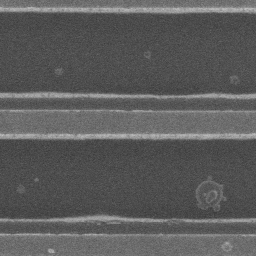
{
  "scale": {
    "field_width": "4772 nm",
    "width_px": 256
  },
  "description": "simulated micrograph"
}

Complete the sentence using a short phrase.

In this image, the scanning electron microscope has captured lines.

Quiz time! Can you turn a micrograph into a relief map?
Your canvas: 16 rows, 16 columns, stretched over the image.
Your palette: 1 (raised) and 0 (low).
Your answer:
1111111111111111
0000000000000000
0000000000000000
0000000000000000
0000000000000000
0000000000000000
1111111111111111
1111111111111111
0011111111101111
0000000000000000
0000000000000000
0000000000000000
0000000000000000
0000000000000000
1111111111111111
1111111111111111